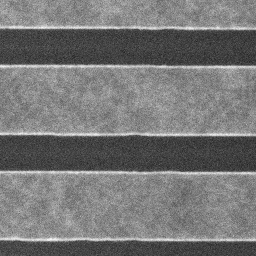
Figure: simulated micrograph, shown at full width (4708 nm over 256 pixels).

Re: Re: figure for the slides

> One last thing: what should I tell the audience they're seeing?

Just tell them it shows lines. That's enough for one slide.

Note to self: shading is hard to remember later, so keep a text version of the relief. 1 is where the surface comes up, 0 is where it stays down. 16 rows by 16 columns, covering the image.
1111111111111111
1111111111111111
0000000000000000
0000000000000000
1111111111111111
1111111111111111
1111111111111111
1111111111111111
0000000000000000
0000000000000000
0000000000000000
1111111111111111
1111111111111111
1111111111111111
1111111111111111
0000000000000000